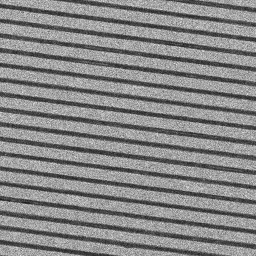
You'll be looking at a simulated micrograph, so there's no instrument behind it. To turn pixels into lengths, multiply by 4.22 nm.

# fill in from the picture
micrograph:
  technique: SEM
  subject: parallel lines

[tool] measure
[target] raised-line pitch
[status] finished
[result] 14.7 px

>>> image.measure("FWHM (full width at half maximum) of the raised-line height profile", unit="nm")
42.9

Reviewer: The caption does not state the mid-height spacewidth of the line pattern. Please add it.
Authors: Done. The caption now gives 4.57 pixels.